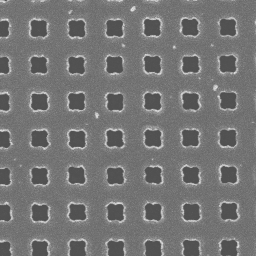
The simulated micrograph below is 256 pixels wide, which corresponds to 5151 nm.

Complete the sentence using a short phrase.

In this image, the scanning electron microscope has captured a regular array of holes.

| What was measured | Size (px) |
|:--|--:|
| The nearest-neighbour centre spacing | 36.7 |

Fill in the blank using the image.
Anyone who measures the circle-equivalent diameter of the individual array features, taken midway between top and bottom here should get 0.359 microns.